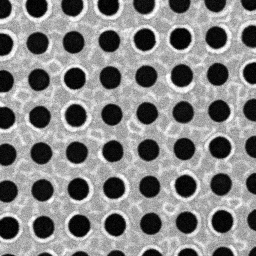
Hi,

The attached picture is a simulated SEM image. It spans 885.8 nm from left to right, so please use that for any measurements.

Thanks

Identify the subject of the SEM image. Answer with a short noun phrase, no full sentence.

a regular array of holes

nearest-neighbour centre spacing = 0.123 microns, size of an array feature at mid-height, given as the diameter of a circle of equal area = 0.078 µm